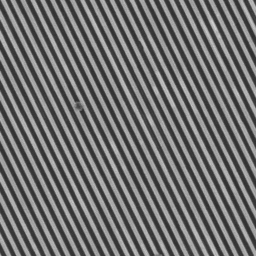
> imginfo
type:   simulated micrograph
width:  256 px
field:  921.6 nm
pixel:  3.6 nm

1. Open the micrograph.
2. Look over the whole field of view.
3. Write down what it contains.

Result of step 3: parallel lines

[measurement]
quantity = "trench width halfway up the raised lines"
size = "16.6 nm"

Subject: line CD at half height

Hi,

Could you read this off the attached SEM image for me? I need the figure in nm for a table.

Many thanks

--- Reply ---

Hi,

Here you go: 13.4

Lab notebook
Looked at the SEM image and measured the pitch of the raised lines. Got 8.89 pixels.